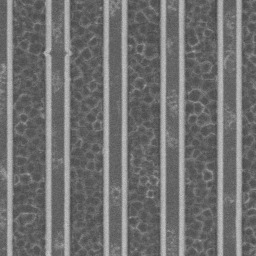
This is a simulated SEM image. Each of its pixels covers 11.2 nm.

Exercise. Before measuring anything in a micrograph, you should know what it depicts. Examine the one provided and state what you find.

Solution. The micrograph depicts parallel lines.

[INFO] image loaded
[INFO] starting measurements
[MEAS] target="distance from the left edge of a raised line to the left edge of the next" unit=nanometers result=644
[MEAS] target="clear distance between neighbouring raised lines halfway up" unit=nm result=444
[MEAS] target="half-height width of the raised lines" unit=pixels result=18.1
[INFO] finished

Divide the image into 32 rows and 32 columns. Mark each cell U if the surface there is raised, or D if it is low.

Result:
UDDDDDUUDDDDDUUUDDDDUUUDDDDDUUDD
UDDDDDUUDDDDDUUUDDDDUUUDDDDDUUDD
UDDDDDUUDDDDDUUUDDDDUUUDDDDDUUDD
UDDDDDUUDDDDDUUUDDDDUUUDDDDDUUDD
UDDDDDUUDDDDDUUUDDDDUUUDDDDDUUDD
UDDDDDUUDDDDDUUUDDDDUUUDDDDDUUDD
UDDDDDUUUDDDDUUUDDDDUUUDDDDDUUDD
UDDDDDUUDDDDDUUUDDDDUUUDDDDDUUDD
UDDDDDUUDDDDDUUUDDDDUUUDDDDDUUDD
UDDDDDUUDDDDDUUUDDDDUUUDDDDDUUDD
UDDDDDUUDDDDDUUUDDDDUUUDDDDDUUDD
UDDDDDUUDDDDDUUUDDDDUUUDDDDDUUDD
UDDDDDUUDDDDDUUUDDDDUUUDDDDDUUDD
UDDDDDUUDDDDDUUUDDDDUUUDDDDDUUDD
UDDDDDUUDDDDDUUUDDDDUUUDDDDDUUDD
UDDDDDUUDDDDDUUUDDDDUUUDDDDDUUDD
UDDDDDUUDDDDDUUUDDDDUUUDDDDDUUDD
UDDDDDUUDDDDDUUUDDDDUUUDDDDDUUDD
UDDDDDUUDDDDDUUUDDDDUUUDDDDDUUDD
UDDDDDUUDDDDDUUUDDDDUUUDDDDDUUDD
UDDDDDUUDDDDDUUUDDDDUUUDDDDDUUDD
UDDDDDUUDDDDDUUUDDDDUUUDDDDDUUDD
UDDDDDUUDDDDDUUUDDDDUUUDDDDDUUDD
UDDDDDUUDDDDDUUUDDDDUUUDDDDDUUDD
UDDDDDUUDDDDDUUUDDDDUUUDDDDDUUDD
UDDDDDUUDDDDDUUUDDDDUUUDDDDDUUDD
UDDDDDUUDDDDDUUUDDDDUUUDDDDDUUDD
UDDDDDUUDDDDDUUUDDDDUUUDDDDDUUDD
UDDDDDUUDDDDDUUUDDDDUUUDDDDDUUDD
UDDDDDUUDDDDDUUUDDDDUUUDDDDDUUDD
UDDDDDUUDDDDDUUUDDDDUUUDDDDDUUDD
UDDDDDUUDDDDDUUUDDDDUUUDDDDDUUDD